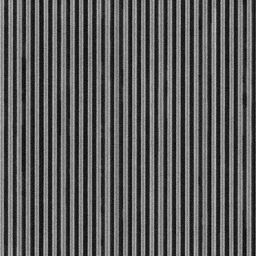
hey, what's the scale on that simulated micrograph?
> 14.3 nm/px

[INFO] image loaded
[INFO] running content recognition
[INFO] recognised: parallel lines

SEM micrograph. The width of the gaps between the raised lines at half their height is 76.9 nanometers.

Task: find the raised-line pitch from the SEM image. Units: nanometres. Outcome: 126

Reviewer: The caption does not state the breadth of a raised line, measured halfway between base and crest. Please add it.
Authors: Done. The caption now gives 3.63 pixels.